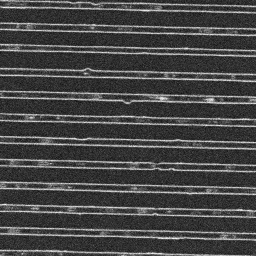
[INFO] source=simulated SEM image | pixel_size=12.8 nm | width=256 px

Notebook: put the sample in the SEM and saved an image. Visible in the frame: parallel lines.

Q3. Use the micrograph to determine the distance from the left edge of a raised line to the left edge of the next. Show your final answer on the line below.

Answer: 0.291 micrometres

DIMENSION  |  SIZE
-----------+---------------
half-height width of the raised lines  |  0.0866 µm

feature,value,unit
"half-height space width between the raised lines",199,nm